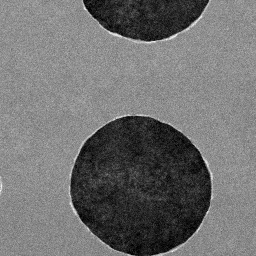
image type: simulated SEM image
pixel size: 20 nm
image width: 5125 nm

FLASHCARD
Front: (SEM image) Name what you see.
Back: holes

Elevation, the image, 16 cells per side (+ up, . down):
+++++........+++
++++++......++++
+++++++++.++++++
++++++++++++++++
++++++++++++++++
++++++++++++++++
++++++++++++++++
+++++++...++++++
++++++......++++
+++++.......++++
+++++........+++
++++.........+++
++++.........+++
+++++........+++
++++++......++++
+++++++....+++++